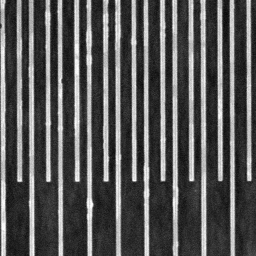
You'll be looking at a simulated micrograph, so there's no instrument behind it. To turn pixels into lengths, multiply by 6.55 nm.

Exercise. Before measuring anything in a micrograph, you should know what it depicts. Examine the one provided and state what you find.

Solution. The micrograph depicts parallel lines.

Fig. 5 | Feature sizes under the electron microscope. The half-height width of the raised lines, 24.6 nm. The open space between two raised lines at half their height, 73.7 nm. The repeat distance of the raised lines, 0.0948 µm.